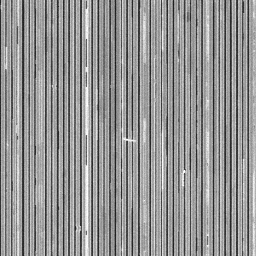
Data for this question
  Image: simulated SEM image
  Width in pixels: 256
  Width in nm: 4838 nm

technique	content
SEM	parallel lines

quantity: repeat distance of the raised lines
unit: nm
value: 109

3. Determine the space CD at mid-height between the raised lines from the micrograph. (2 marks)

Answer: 33.1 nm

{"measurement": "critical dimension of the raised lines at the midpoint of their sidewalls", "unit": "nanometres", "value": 68.5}